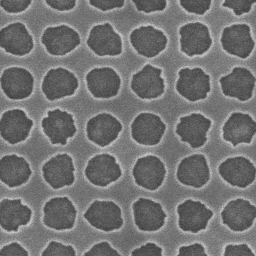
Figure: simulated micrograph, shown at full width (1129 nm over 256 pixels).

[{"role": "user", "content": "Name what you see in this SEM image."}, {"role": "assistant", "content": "a regular array of holes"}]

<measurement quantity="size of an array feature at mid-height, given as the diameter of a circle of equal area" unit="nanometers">149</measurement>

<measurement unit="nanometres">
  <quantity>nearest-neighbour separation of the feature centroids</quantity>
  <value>187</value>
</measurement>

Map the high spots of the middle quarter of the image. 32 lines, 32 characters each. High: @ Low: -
@@@@@@@@@@@@@@@@@@@@--@@@@@@@@@@
-@@@@@@------@@@@@@-----@@@@@---
--@@@@-------@@@@@------@@@@@---
---@@---------@@@--------@@@@---
----@@--------@@@--------@@@----
----@@--------@@@--------@@@----
---@@@--------@@@--------@@@----
--@@@@@------@@@@@-------@@@@---
@@@@@@@@----@@@@@@@----@@@@@@@--
@@@@@@@@@@@@@@@@@@@@@@@@@@@@@@@@
@@@@@@@@@@@@@@@@@@@@@@@@@@@@@@@@
@@@@@@@@@@@@@@@@@@@@@@@@@@@@@@@@
-@@@@@@@@--@@@@@@@@----@@@@@@@@@
--@@@@@------@@@@@------@@@@@---
---@@@--------@@@--------@@@@---
---@@@--------@@@--------@@@----
---@@@--------@@@--------@@@----
---@@@--@-----@@@--------@@@----
-@@@@@-------@@@@-------@@@@@---
-@@@@@@-----@@@@@@------@@@@@@--
@@@@@@@@@--@@@@@@@@@@@@@@@@@@@@-
@@@@@@@@@@@@@@@@@@@@@@@@@@@@@@@@
-@@@@@@@@--@@@@@@@@@@@@@@@@@@@@@
--@@@@@------@@@@@@-----@@@@@@--
--@@@@-------@@@@@-------@@@@---
---@@@--------@@@--------@@@----
---@@---------@@@--------@@@----
---@@---------@@@---------@@----
---@@---------@@@@-------@@@----
--@@@@@-----@@@@@@-------@@@@---
-@@@@@@@@--@@@@@@@@-----@@@@@@@-
@@@@@@@@@@@@@@@@@@@@@--@@@@@@@@@